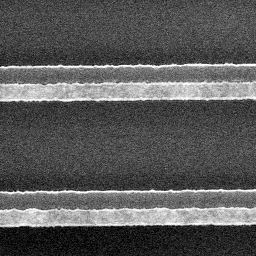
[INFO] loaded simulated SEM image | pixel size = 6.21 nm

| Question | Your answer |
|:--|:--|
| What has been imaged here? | lines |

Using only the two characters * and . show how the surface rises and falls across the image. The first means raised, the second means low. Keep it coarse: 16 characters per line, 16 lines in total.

................
................
................
................
****************
****************
................
................
................
................
................
................
****************
****************
................
................